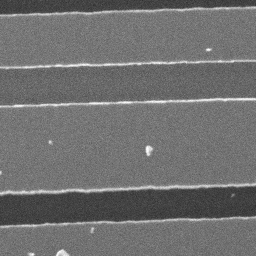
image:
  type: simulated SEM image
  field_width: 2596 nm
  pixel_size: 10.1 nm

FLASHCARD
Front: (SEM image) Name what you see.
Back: lines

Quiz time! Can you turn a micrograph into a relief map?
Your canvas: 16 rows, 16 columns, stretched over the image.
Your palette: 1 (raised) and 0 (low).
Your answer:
0000000000000111
1111111111111111
1111111111111111
1111111111111111
1111111111111111
1111111111111111
1111111111111111
1111111111111111
1111111111111111
1111111111111111
1111111111111111
1111111111111111
0000000000000000
0000000000000000
1111111111111111
1111111111111111